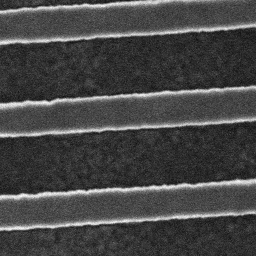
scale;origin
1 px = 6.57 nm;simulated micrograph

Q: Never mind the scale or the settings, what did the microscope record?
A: lines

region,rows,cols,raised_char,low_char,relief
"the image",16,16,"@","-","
--@@@@@@@@@@@@@@
@@@@@@@@@@@@@@@@
@@@@@-----------
----------------
----------------
--------------@@
@@@@@@@@@@@@@@@@
@@@@@@@@@@@@@@@@
@---------------
----------------
----------------
------------@@@@
@@@@@@@@@@@@@@@@
@@@@@@@@@@@@@@--
----------------
----------------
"